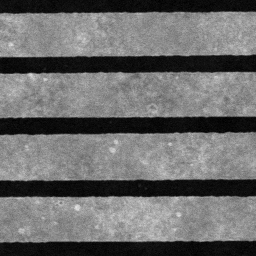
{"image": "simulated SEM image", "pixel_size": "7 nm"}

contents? lines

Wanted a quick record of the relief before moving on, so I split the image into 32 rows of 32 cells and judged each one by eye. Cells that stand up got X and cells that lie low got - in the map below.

--------------------------------
--------------------------------
XXXXXXXXXXXXXXXXXXXXXXXXXXXXXXXX
XXXXXXXXXXXXXXXXXXXXXXXXXXXXXXXX
XXXXXXXXXXXXXXXXXXXXXXXXXXXXXXXX
XXXXXXXXXXXXXXXXXXXXXXXXXXXXXXXX
XXXXXXXXXXXXXXXXXXXXXXXXXXXXXXXX
--------------------------------
--------------------------------
XXXXXXXXXXXXXXXXXXXXXXXXXXXXXXXX
XXXXXXXXXXXXXXXXXXXXXXXXXXXXXXXX
XXXXXXXXXXXXXXXXXXXXXXXXXXXXXXXX
XXXXXXXXXXXXXXXXXXXXXXXXXXXXXXXX
XXXXXXXXXXXXXXXXXXXXXXXXXXXXXXXX
XXXXXXXXXXXXXXXXXXXXX----X------
--------------------------------
--------------------------------
XXXXXXXXXXXXXXXXXXXXXXXXXXXXXXXX
XXXXXXXXXXXXXXXXXXXXXXXXXXXXXXXX
XXXXXXXXXXXXXXXXXXXXXXXXXXXXXXXX
XXXXXXXXXXXXXXXXXXXXXXXXXXXXXXXX
XXXXXXXXXXXXXXXXXXXXXXXXXXXXXXXX
---X-XX-------------------------
--------------------------------
--------------------------------
XXXXXXXXXXXXXXXXXXXXXXXXXXXXXXXX
XXXXXXXXXXXXXXXXXXXXXXXXXXXXXXXX
XXXXXXXXXXXXXXXXXXXXXXXXXXXXXXXX
XXXXXXXXXXXXXXXXXXXXXXXXXXXXXXXX
XXXXXXXXXXXXXXXXXXXXXXXXXXXXXXXX
--------------------------------
--------------------------------